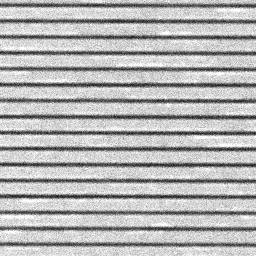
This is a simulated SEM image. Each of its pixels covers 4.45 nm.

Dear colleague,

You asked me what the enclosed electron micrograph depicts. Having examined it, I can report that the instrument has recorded parallel lines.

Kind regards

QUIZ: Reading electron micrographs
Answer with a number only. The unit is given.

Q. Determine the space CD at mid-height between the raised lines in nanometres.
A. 21.2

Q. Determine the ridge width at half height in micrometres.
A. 0.0495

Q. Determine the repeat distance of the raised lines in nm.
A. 70.9